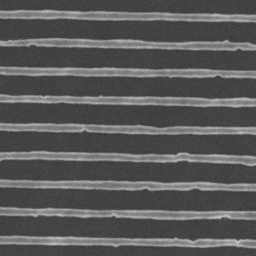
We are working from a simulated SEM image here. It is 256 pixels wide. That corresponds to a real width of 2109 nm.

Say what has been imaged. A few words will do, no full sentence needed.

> parallel lines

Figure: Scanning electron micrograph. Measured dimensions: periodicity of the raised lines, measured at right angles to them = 28.2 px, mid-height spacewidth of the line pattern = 20.9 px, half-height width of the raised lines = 0.0577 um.